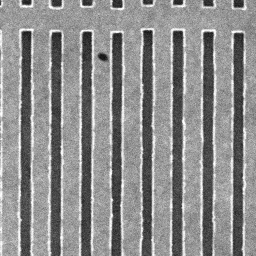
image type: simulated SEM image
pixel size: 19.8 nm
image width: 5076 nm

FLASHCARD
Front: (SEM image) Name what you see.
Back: parallel lines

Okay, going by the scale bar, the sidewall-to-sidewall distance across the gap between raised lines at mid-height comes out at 208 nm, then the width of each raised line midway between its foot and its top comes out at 0.394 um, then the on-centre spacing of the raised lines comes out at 30.4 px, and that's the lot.